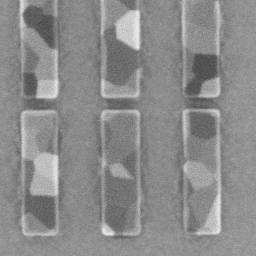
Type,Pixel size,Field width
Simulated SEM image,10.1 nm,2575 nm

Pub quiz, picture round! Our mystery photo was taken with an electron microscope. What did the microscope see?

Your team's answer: wiring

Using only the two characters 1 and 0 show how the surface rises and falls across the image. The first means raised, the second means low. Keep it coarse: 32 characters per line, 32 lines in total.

00011110000001111000000111100000
00011110000001111000000111100000
00011110000001111000000111100000
00011110000001111000000111100000
00011110000001111000000111100000
00011110000001111000000111100000
00011110000001111000000111100000
00011110000001111000000111100000
00011110000001111000000111100000
00011110000001111000000111100000
00011110000001111000000111100000
00011110000001111000000111100000
00000000000000000000000000000000
00000000000000000000000000000000
00011110000001111000000111100000
00011110000001111000000111100000
00011110000001111000000111100000
00011110000001111000000111100000
00011110000001111000000111100000
00011110000001111000000111100000
00011110000001111000000111100000
00011110000001111000000111100000
00011110000001111000000111100000
00011110000001111000000111110000
00011110000001111100000111110000
00011110000001111100000111100000
00011110000001111100000111100000
00011110000001111100000111100000
00011110000001111100000111100000
00000000000000000000000000000000
00000000000000000000000000000000
00000000000000000000000000000000